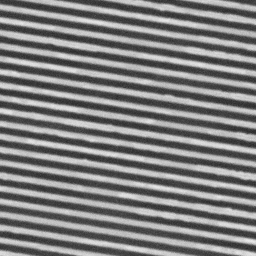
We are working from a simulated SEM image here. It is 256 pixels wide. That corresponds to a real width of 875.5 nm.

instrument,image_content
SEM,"parallel lines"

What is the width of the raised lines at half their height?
0.0156 um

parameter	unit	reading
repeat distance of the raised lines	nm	43.7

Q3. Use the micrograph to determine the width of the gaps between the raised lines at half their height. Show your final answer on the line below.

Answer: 27.4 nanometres